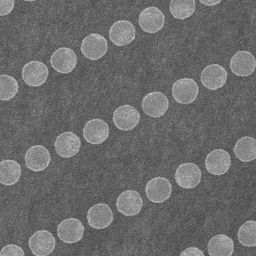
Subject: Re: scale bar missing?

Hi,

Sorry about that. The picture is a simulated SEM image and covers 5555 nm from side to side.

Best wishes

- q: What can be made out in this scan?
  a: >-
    a regular array of raised bodies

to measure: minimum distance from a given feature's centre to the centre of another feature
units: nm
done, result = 694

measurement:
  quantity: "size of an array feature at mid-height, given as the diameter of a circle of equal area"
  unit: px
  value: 25.3